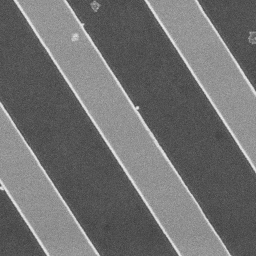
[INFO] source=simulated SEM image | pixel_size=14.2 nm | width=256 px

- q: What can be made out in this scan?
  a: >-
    lines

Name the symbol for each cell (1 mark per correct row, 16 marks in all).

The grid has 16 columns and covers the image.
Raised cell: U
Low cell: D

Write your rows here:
DUUUDDDDDUUUUDDD
DDUUUDDDDDUUUDDD
DDDUUUDDDDDUUUDD
DDDUUUDDDDDUUUUD
DDDDUUUDDDDDUUUD
DDDDUUUUDDDDDUUU
DDDDDUUUDDDDDUUU
UDDDDDUUUDDDDDUU
UDDDDDUUUUDDDDDU
UUDDDDDUUUDDDDDU
UUUDDDDDUUUDDDDD
UUUDDDDDUUUUDDDD
DUUUDDDDDUUUDDDD
DUUUUDDDDDUUUDDD
DDUUUDDDDDUUUDDD
DDDUUUDDDDDUUUDD